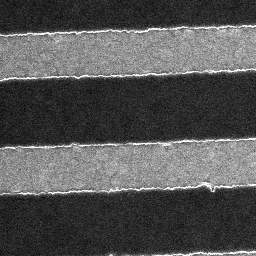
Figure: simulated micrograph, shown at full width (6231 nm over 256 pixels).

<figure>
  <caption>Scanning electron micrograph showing one or a few lines or trenches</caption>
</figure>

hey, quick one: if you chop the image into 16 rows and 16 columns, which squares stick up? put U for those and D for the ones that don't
UUUUUUUUUUUUUUUU
UUUUUUUUUUUUUUUU
DDDDDDDDDDDUDDDD
DDDDDDDDDDDDDDDD
DDDDDDDDDUUUUUUU
UUUUUUUUUUUUUUUU
UUUUUUUUUUUUUUUU
UUUUUUUUUUUUUUUU
UUUUUUUUUUUUUUUU
DDDDDDUDDDDDDDDD
DDDDDDDDDDDDDDDD
DDDDDDDDDDDDDDDU
UUUUUUUUUUUUUUUU
UUUUUUUUUUUUUUUU
UUUUUUUUUUUUUUUU
UUUUUUUUUUUUUUUU